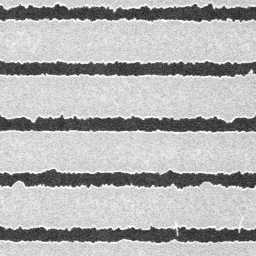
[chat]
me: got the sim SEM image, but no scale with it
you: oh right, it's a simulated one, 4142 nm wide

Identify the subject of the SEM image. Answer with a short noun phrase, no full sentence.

parallel lines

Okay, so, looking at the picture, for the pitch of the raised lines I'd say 895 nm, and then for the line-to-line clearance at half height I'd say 224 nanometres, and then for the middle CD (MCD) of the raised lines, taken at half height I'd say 669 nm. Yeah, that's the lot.